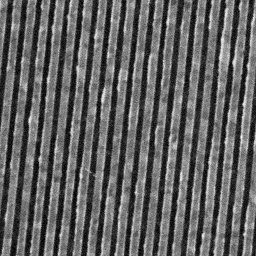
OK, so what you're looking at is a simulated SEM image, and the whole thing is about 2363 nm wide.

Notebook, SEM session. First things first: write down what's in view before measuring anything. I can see parallel lines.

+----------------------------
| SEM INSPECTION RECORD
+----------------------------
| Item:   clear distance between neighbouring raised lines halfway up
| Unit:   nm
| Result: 56.3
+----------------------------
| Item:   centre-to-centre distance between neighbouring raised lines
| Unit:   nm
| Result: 130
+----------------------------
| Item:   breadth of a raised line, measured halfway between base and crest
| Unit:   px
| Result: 7.96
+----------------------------